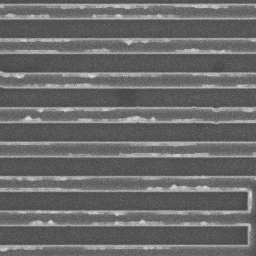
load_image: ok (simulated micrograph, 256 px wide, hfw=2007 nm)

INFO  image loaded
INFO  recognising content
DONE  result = parallel lines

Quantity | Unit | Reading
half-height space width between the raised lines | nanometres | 155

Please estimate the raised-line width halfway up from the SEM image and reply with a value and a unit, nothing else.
118 nanometres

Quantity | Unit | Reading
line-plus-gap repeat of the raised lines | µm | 0.27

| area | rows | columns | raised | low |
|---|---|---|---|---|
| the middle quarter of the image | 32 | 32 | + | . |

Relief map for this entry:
................................
................................
.............................+++
++++++++++++++++++++++++++++++++
++++++++++++++++++++++++++++++++
++++++++++++++++++++++++++++++++
................................
................................
................................
................................
................................
++++++++++++++++++++++++++++++++
++++++++++++++++++++++++++++++++
++++++++++++++++++++++++++++++++
................................
................................
................................
................................
................................
................................
++++++++++++++++++++++++++++++++
++++++++++++++++++++++++++++++++
++++++++++++++++++++++++++++++++
................................
................................
................................
................................
................................
++++++++++++++++++++++++++++++++
++++++++++++++++++++++++++++++++
++++++++++++++++++++++++++++++++
++++++++++++++++++++++++++++++++